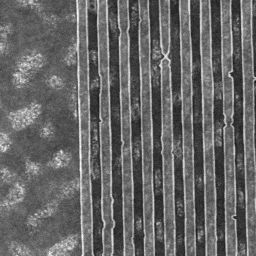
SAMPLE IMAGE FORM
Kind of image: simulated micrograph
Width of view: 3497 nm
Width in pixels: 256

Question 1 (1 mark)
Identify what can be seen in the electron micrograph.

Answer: parallel lines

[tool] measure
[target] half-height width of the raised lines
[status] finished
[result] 138 nanometres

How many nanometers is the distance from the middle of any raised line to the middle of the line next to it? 281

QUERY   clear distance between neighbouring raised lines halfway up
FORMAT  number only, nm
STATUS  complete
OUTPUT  148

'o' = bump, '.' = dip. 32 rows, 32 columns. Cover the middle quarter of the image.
....oo...oo...oo...oo...oo....oo
....oo...oo...oo...oo...oo....oo
....oo...oo...oo...ooo...oo...oo
....oo...oo...oo...ooo..ooo..ooo
....oo...oo...oo...ooo..oo...ooo
....oo...oo...oo...ooo..ooo..ooo
....oo...oo...oo...ooo..ooo..ooo
....oo...oo...oo...ooo..ooo..ooo
....oo...oo...oo...ooo..ooo..ooo
....oo...oo...oo...ooo..ooo...oo
....oo...oo...oo...ooo..ooo...oo
....oo...oo...ooo..ooo...oo...oo
....oo...oo...ooo..ooo...oo...oo
....oo...oo...ooo..ooo...oo...oo
....oo...oo....oo...oo...oo...oo
....oo...oo....oo..ooo...oo...oo
....oo...ooo..ooo..ooo...oo...oo
....oo...ooo..ooo..ooo..ooo...oo
....oo...ooo..ooo...oo..ooo...oo
....oo...ooo...oo...oo...oo...oo
....oo...ooo..ooo...oo...oo...oo
....oo...ooo..ooo...oo...oo...oo
....oo...ooo...oo...oo..ooo...oo
....oo...ooo...oo...oo...oo...oo
....oo...ooo...oo...oo...oo...oo
....oo...ooo...oo...oo...oo...oo
....oo...ooo...oo...oo...oo...oo
....oo....oo...oo...oo...oo...oo
....oo....oo...oo...oo...oo...oo
....oo....oo...oo...oo...oo...oo
....oo....oo...oo...oo...oo...oo
....ooo..ooo...oo...oo...oo...oo